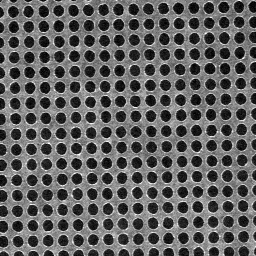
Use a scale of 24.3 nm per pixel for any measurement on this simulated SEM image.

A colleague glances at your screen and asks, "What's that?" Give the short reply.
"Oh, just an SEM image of a regular array of holes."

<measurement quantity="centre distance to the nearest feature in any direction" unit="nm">362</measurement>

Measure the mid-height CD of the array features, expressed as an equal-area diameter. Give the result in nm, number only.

285